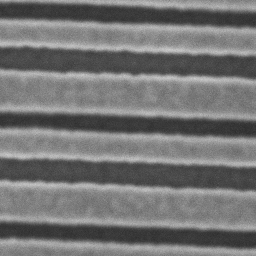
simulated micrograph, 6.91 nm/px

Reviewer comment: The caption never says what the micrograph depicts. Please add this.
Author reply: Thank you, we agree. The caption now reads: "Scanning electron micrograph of lines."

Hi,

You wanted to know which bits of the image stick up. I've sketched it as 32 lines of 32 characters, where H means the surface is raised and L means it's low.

LLLLLLLLLLLLLLHHHHHHHHHHHHHHHHHH
LLLLLLLLLLLLLLLLLLLLLLLLLLLLLLLL
LLLLLLLLLLLLLLLLLLLLLLLLLLLLLLLL
HHHHHHHHHHHHHHHHHHHHHHHHHHHLLLLL
HHHHHHHHHHHHHHHHHHHHHHHHHHHHHHHH
HHHHHHHHHHHHHHHHHHHHHHHHHHHHHHHH
LLLLLLLLLLLLLLLLLLLLLLHHHHHHHHHH
LLLLLLLLLLLLLLLLLLLLLLLLLLLLLLLL
LLLLLLLLLLLLLLLLLLLLLLLLLLLLLLLL
HHHHHHHHHHHHHHHHHHHHLHLLLLLLLLLL
HHHHHHHHHHHHHHHHHHHHHHHHHHHHHHHH
HHHHHHHHHHHHHHHHHHHHHHHHHHHHHHHH
HHHHHHHHHHHHHHHHHHHHHHHHHHHHHHHH
HHHHHHHHHHHHHHHHHHHHHHHHHHHHHHHH
LLLLLLLLLLLLLLLLLLLLLLHHHHHHHHHH
LLLLLLLLLLLLLLLLLLLLLLLLLLLLLLLL
HHHHHHHHLLLLLLLLLLLLLLLLLLLLLLLL
HHHHHHHHHHHHHHHHHHHHHHHHHHHHHHHH
HHHHHHHHHHHHHHHHHHHHHHHHHHHHHHHH
HHHHHHHHHHHHHHHHHHHHHHHHHHHHHHHH
LLLLLLLLLLLLLLLLLLLLLLLLLHHHHHHH
LLLLLLLLLLLLLLLLLLLLLLLLLLLLLLLL
LLLLLLLLLLLLLLLLLLLLLLLLLLLLLLLL
HHHHHHHHHHHHHHHHHHLHLLLLLLLLLLLL
HHHHHHHHHHHHHHHHHHHHHHHHHHHHHHHH
HHHHHHHHHHHHHHHHHHHHHHHHHHHHHHHH
HHHHHHHHHHHHHHHHHHHHHHHHHHHHHHHH
LLHHHHHHHHHHHHHHHHHHHHHHHHHHHHHH
LLLLLLLLLLLLLLLLLLLLLLLLLHLHHHHH
LLLLLLLLLLLLLLLLLLLLLLLLLLLLLLLL
HHHHHHHHHHHHLLLLLLLLLLLLLLLLLLLL
HHHHHHHHHHHHHHHHHHHHHHHHHHHHHHHH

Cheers